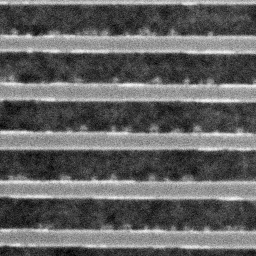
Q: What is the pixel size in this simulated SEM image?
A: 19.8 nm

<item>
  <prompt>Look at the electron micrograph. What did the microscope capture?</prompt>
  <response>lines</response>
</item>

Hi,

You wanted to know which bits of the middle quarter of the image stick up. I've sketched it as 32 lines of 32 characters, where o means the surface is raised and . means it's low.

................................
................................
................................
................................
................................
oooooooooooooooooooooooooooooooo
oooooooooooooooooooooooooooooooo
oooooooooooooooooooooooooooooooo
oooooooooooooooooooooooooooooooo
................................
................................
................................
................................
................................
................................
................................
................................
oooooooooooooooo................
oooooooooooooooooooooooooooooooo
oooooooooooooooooooooooooooooooo
oooooooooooooooooooooooooooooooo
................................
................................
................................
................................
................................
................................
................................
................................
oo.ooooooooooooooo..............
oooooooooooooooooooooooooooooooo
oooooooooooooooooooooooooooooooo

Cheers